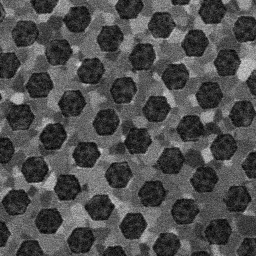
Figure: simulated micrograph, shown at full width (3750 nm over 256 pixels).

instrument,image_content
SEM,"a regular array of holes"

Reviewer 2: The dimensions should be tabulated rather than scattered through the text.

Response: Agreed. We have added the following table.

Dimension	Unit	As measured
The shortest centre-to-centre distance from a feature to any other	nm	544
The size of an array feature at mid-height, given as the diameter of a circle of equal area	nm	401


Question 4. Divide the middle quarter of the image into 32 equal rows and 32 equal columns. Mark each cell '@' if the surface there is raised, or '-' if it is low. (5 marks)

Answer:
@@@@------@@@@@@@-----@@@@----@@
@@@-------@@@@@@@@---@@@@------@
@@@-------@@@@@@@@@@@@@@-------@
@@@@-----@@@@----@@@@@@@-------@
@@@@-----@@@------@@@@@@@------@
@@@@@@@@@@@@------@@@@@@@-----@@
@@--@@@@@@@-------@@@@@@@@---@@@
@@---@@@@@@@------@@@@@@@@@@@@@@
-----@@@@@@@-----@@@@-----@@@@@@
------@@@@@@@----@@@@-----@@@@@@
-----@@@@@@@@@@@@@@@---@---@@@@@
-----@@@@----@@@@@@----@---@@@@@
----@@@@-----@@@@@@@------@@@@@@
@@@@@@@-------@@@@@@------@@@---
@@@@@@@-------@@@@@@@----@@@@---
@@@@@@@-------@@@@@@@@@@@@@@----
@@@@@@@@-----@@@-----@@@@@@@----
-@@@@@@@----@@@@-----@@@@@@@----
-@@@@@@@@@@@@@@-------@@@@@@@---
@@@@----@@@@@@@-------@@@@@@@@@-
@@@-@---@@@@@@@-------@@@@@@@@@@
@@--@----@@@@@@@-----@@@@----@@@
@@-------@@@@@@@----@@@@------@@
@@-------@@@@@@@@@@@@@@-------@@
@@@-----@@@@----@@@@@@@-------@@
@@@-----@@@--@@-@@@@@@@@---@--@@
@@@@@@@@@@@------@@@@@@@-----@@@
@@@@@@@@@@-------@@@@@@@@---@@@@
---@@@@@@@-------@@@@@@@@@@@@@@-
----@@@@@@@-----@@@@----@@@@@@@-
----@@@@@@@-----@@@------@@@@@@@
----@@@@@@@@@@@@@@@-------@@@@@@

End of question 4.